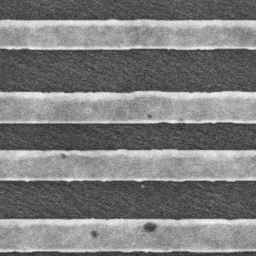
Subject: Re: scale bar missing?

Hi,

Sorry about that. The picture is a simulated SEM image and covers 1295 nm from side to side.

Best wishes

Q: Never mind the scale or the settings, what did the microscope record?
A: lines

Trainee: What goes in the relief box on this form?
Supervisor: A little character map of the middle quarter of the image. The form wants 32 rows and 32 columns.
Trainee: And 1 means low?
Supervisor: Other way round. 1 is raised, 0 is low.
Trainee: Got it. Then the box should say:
00000000000000000000000000000000
00000000000000000000000000000000
00000000000000000000000000000000
00000000000000000000000000000000
00000000000000000000000000000000
00000000000000000000000000000000
00000000000000000000000000000000
00000000000000000111111111100000
11111111111111111111111111111111
11111111111111111111111111111111
11111111111111111111111111111111
11111111111111111111111111111111
11111111111111111111111111111111
11111111111111111111111111111111
11111111111111111111111100111111
00000000000000000000000000000000
00000000000000000000000000000000
00000000000000000000000000000000
00000000000000000000000000000000
00000000000000000000000000000000
00000000000000000000000000000000
00000000000000000000000000000000
11111111111111111111111111111111
11111111111111111111111111111111
11111111111111111111111111111111
11111111111111111111111111111111
11111111111111111111111111111111
11111111111111111111111111111111
11111111111111111111111111111111
00000000000000000000000000000000
00000000000000000000000000000000
00000000000000000000000000000000